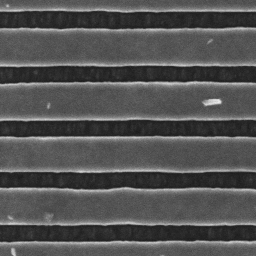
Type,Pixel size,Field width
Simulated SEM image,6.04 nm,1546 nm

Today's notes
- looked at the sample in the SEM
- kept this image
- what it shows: lines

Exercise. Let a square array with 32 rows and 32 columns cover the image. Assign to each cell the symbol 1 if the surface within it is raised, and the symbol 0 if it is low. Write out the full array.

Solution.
11111111111111111111111111111111
00000000000000011001000000000000
00000000000000000000000000000000
00000000000000000000000000000010
11111111111111111111111111111111
11111111111111111111111111111111
11111111111111111111111111111111
11111111111111111111111111111111
00000000000000000000000000000000
00000000000000000000000000000000
11111111111111111111111111111111
11111111111111111111111111111111
11111111111111111111111111111111
11111111111111111111111111111111
11111111111111111111111111111111
00000000000000000000000000000000
00000000000000000000000000000000
11111111111111111111111111111111
11111111111111111111111111111111
11111111111111111111111111111111
11111111111111111111111111111111
01000011011111100000111111000001
00000000000000000000000000000000
00000000000000010000000000000000
11111111111111111111111111111111
11111111111111111111111111111111
11111111111111111111111111111111
11111111111111111111111111111111
00000000000000000000000000000000
00000000000000000000000000000000
11111111111111111111111111111111
11111111111111111111111111111111